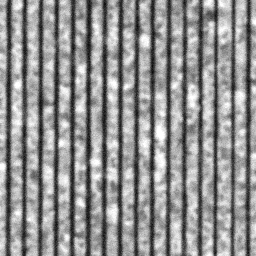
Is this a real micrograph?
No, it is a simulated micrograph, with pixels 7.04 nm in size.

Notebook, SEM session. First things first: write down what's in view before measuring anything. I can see parallel lines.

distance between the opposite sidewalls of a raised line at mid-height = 74.8 nm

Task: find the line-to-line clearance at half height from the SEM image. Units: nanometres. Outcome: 37.9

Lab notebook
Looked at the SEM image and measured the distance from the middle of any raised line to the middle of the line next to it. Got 112 nm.